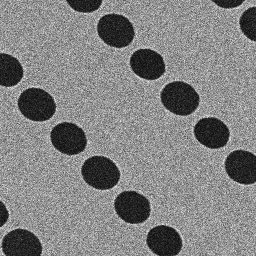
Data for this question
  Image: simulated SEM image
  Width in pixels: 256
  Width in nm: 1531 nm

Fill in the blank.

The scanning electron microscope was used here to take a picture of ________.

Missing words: a regular array of holes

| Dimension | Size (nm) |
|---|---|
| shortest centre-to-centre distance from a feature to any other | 279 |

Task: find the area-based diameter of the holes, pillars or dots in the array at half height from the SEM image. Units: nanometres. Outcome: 210